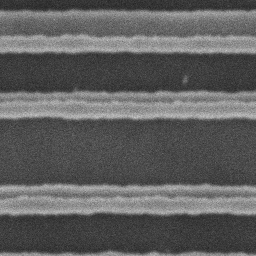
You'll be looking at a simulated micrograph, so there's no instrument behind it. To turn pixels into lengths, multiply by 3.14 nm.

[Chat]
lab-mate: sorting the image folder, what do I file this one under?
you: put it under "lines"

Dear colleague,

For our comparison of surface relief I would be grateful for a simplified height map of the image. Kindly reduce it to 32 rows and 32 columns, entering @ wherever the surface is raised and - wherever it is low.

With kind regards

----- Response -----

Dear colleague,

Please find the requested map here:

--------------------------------
@@@@--@-@@@@@@@@-@@-----@@@@@@@@
@@@@@@@@@@@@@@@@@@@@@@@@@@@@@@@@
@@@@@@@@@@@@@@@@@@@@@@@@@@@@@@@@
@@@@@@@@@@@@@@@@@@@@@@@@@@@@@@@@
@@@@@@@@@@@@@@@@@@@@@@@@@@@@@@@@
------------------------@@@-@@-@
--------------------------------
--------------------------------
--------------------------------
--------------------------------
-------------------------@------
@@@@@@@@@@@@@@@@@@@@@@@@@@@@@@@@
@@@@@@@@@@@@@@@@@@@@@@@@@@@@@@@@
@@@@@--@@@@@@@@@@@@@@@@@@@@@@@@@
--------------------------------
--------------------------------
--------------------------------
--------------------------------
--------------------------------
--------------------------------
--------------------------------
--------------------------------
@@@@@@@@@@@@@@@-@@@@@@@@@@@@@@@-
@@@@@@@@@@@@@@@@@@@@@@@@@@@@@@@@
@@@@@@@@@@@@@@@@@@@@@@@@@@@@@@@@
@@@@@@@@@@@@@@@@@@@@@@@@@@@@@@@@
--------------------------------
--------------------------------
--------------------------------
--------------------------------
--------------------------------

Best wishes